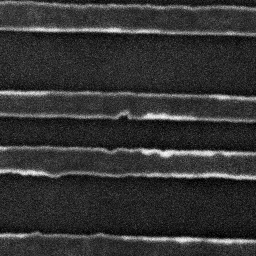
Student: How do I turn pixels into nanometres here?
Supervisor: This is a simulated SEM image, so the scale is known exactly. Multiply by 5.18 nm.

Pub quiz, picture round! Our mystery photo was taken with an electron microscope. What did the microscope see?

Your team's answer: one or a few lines or trenches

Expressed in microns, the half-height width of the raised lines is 0.134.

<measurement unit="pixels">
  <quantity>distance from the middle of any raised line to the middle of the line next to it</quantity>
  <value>71.9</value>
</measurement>